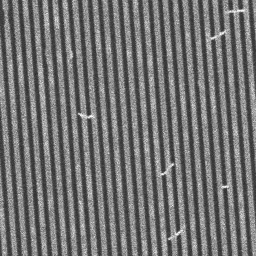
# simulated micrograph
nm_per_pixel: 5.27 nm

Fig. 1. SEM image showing parallel lines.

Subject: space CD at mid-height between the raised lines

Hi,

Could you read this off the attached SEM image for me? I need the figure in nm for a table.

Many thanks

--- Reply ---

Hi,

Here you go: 21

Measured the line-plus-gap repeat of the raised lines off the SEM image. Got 0.0525 micrometres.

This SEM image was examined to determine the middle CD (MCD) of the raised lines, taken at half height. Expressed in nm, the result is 30.8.